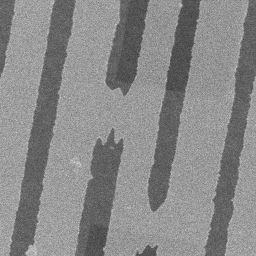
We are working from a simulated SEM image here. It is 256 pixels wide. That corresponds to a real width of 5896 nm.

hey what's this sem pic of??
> one or a few lines or trenches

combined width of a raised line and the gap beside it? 1.43 microns